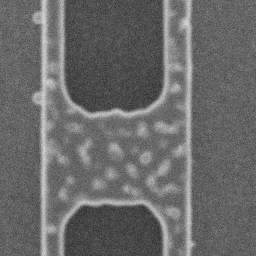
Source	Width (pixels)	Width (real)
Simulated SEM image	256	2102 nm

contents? one or a few lines or trenches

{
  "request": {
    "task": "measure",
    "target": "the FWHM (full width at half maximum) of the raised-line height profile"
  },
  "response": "206 nm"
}